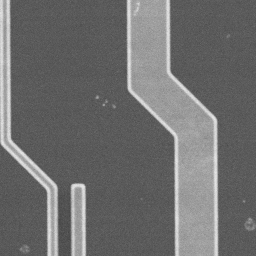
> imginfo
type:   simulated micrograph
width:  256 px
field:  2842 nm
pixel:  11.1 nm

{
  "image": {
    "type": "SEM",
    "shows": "groups of lines, slits or small figures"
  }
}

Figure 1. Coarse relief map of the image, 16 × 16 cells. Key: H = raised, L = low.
HLLLLLLLHHLLLLLL
HLLLLLLLHHLLLLLL
HLLLLLLLHHLLLLLL
HLLLLLLLHHHLLLLL
LLLLLLLLHHHLLLLL
LLLLLLLLHHHHLLLL
LLLLLLLLLHHHHLLL
HLLLLLLLLLHHHLLL
HLLLLLLLLLLHHLLL
LLLLLLLLLLLHHHLL
LLLLLLLLLLLHHHLL
LLLLLLLLLLLHHHLL
LLLLLLLLLLLHHHLL
LLLLLLLLLLLHHHLL
LLLLLLLLLLLHHHLL
LLLLLLLLLLLHHHLL